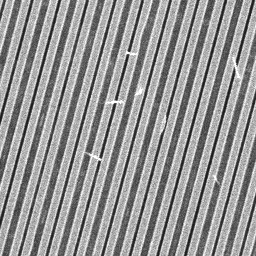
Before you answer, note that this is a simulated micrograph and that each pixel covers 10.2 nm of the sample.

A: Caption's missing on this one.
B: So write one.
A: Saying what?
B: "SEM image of parallel lines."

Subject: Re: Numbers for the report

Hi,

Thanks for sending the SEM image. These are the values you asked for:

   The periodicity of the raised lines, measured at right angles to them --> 136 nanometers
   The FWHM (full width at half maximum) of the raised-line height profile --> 91.4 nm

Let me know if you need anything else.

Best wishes